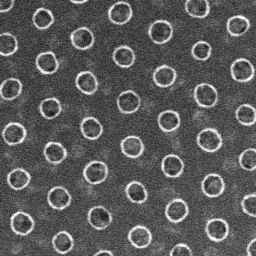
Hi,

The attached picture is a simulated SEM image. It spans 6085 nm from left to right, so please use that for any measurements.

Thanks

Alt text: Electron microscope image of a regular array of raised bodies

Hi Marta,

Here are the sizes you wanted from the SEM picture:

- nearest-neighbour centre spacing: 1050 nanometers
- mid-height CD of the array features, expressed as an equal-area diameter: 498 nanometers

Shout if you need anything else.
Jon